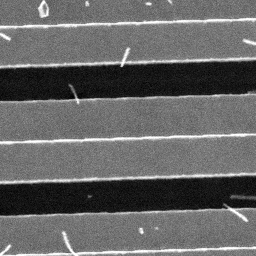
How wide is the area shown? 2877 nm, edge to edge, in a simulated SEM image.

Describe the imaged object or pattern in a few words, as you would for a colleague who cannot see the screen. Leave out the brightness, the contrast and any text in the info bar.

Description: lines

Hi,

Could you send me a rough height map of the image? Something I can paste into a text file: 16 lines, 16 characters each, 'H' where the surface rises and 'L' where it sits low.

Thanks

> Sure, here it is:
HHHHHHHHHHHHHHHH
HHHHHHHHHHHHHHHH
HHHHHHHHHHHHHHHH
HHHHHHHHHHHHHHHH
LLLLLLLLLLLLLLLL
LLLLLLLLLLLLLLLL
HHHHHHHHHHHHHHHH
HHHHHHHHHHHHHHHH
HHHHHHHHHHHHHHHH
HHHHHHHHHHHHHHHH
HHHHHHHHHHHHHHHH
LLLLLLLLLLLLLLLL
LLLLLLLLLLLLLLLL
LHHHHHHHHHHHHHHH
HHHHHHHHHHHHHHHH
HHHHHHHHHHHHHHHH